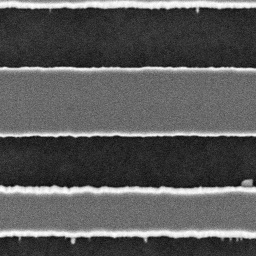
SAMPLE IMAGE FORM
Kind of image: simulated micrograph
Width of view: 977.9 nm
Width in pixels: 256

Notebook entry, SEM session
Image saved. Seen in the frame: lines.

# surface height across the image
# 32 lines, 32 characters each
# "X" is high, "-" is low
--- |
XXXXXXXXXXXXXXXXXXXXXXXXXXXXXXXX
--------------------------------
--------------------------------
--------------------------------
--------------------------------
--------------------------------
--------------------------------
--------------------------------
X-XXX-XXX---XXX--XXXXXXX--X-----
XXXXXXXXXXXXXXXXXXXXXXXXXXXXXXXX
XXXXXXXXXXXXXXXXXXXXXXXXXXXXXXXX
XXXXXXXXXXXXXXXXXXXXXXXXXXXXXXXX
XXXXXXXXXXXXXXXXXXXXXXXXXXXXXXXX
XXXXXXXXXXXXXXXXXXXXXXXXXXXXXXXX
XXXXXXXXXXXXXXXXXXXXXXXXXXXXXXXX
XXXXXXXXXXXXXXXXXXXXXXXXXXXXXXXX
XXXXXXXXXXXXXXXXXXXXXXXXXXXXXXXX
--------------------------------
--------------------------------
--------------------------------
--------------------------------
--------------------------------
--------------------------------
XXXXXXXX-XXX-X-XXX--X----X-XXXXX
XXXXXXXXXXXXXXXXXXXXXXXXXXXXXXXX
XXXXXXXXXXXXXXXXXXXXXXXXXXXXXXXX
XXXXXXXXXXXXXXXXXXXXXXXXXXXXXXXX
XXXXXXXXXXXXXXXXXXXXXXXXXXXXXXXX
XXXXXXXXXXXXXXXXXXXXXXXXXXXXXXXX
---------X------------X--X----XX
--------------------------------
--------------------------------